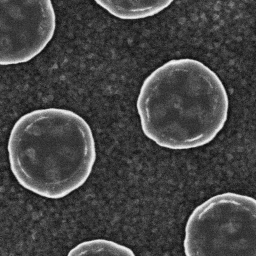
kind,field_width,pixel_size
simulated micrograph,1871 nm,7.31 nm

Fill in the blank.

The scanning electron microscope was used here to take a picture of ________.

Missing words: raised bodies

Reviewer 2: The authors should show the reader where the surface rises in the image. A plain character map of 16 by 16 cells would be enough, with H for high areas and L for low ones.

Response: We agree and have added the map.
HHHLLLLHHHLLLLLL
HHHLLLLLLLLLLLLL
HHHLLLLLLLLLLLLL
HHLLLLLLLLLLLLLL
LLLLLLLLLLHHHLLL
LLLLLLLLLHHHHHLL
LLLLLLLLLHHHHHLL
LHHHHLLLLHHHHHLL
LHHHHHLLLHHHHLLL
LHHHHHLLLLLLLLLL
LHHHHHLLLLLLLLLL
LHHHHLLLLLLLLLLL
LLLLLLLLLLLLLHHH
LLLLLLLLLLLLHHHH
LLLLLLLLLLLLHHHH
LLLLLHHHLLLLHHHH